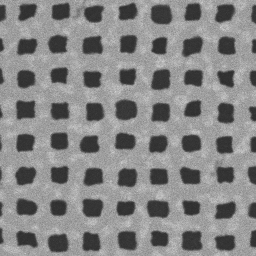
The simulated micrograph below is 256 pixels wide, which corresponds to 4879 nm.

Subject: a regular array of holes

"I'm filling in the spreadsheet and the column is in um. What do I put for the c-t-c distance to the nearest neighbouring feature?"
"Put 0.6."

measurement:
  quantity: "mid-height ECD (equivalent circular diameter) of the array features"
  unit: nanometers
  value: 354